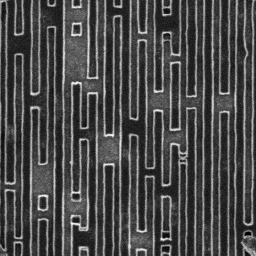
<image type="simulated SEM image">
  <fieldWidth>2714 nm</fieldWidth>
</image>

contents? parallel lines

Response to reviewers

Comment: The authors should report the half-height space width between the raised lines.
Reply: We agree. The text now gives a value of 70.2 nm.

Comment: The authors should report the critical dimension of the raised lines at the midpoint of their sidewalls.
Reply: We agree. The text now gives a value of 0.101 microns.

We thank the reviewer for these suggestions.